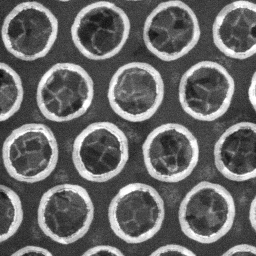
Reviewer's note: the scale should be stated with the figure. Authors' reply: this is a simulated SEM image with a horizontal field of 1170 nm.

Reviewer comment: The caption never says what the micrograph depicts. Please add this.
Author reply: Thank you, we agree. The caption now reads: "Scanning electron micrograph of a regular array of raised bodies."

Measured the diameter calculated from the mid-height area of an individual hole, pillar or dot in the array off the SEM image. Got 0.242 microns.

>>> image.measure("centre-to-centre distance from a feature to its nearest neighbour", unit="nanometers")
317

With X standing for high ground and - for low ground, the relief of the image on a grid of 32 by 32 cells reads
-----------------------------XX-
--XXXX----XXXXX----XXXXX----XXXX
-XXXXXX---XXXXXX---XXXXX---XXXXX
-XXXXXX--XXXXXXX--XXXXXXX--XXXXX
-XXXXXX--XXXXXXX--XXXXXXX--XXXXX
-XXXXX----XXXXX---XXXXXX---XXXXX
--XXXX----XXXX-----XXXX-----XXXX
--------------------------------
X------XXX------XXX-----XXXX----
XX----XXXXX----XXXXX---XXXXX----
XX---XXXXXX---XXXXXX---XXXXXX---
XXX--XXXXXX---XXXXXX---XXXXXX--X
XX---XXXXXX---XXXXXX---XXXXXX---
XX---XXXXXX---XXXXX----XXXXX----
X-----XXX-------XX-------XX-----
------------X-------------------
--XXXX-----XXXX-----XXX-----XXXX
-XXXXXX---XXXXX----XXXXX----XXXX
-XXXXXX--XXXXXXX--XXXXXX---XXXXX
-XXXXXX--XXXXXXX--XXXXXXX--XXXXX
-XXXXXX---XXXXX---XXXXXX---XXXXX
-XXXXX----XXXXX----XXXX-----XXXX
--------------------------------
-------XX-------XX-------XX-----
XX----XXXXX----XXXX-----XXXX----
XX---XXXXXX---XXXXXX---XXXXXX---
XXX--XXXXXX---XXXXXX---XXXXXX---
XX---XXXXXX---XXXXXX---XXXXXX---
XX----XXXXX---XXXXXX---XXXXX----
X------XXX-----XXX------XXX-----
--------------------------------
---XXX-----XXXX-----XXX------XXX